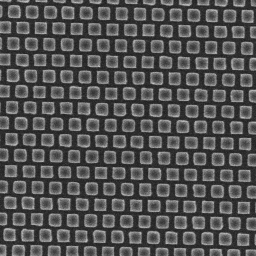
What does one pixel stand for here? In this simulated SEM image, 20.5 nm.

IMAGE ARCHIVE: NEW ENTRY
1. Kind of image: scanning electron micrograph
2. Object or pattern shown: a regular array of raised bodies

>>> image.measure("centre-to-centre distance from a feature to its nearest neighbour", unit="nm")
365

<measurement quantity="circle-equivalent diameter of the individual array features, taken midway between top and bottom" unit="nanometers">278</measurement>